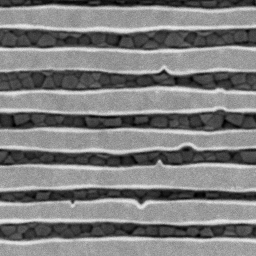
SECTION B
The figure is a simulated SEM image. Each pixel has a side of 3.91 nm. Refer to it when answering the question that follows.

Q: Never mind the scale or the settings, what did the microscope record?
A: parallel lines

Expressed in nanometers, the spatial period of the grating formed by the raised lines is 151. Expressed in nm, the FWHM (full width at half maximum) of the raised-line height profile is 80.6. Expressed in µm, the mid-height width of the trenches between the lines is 0.0688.